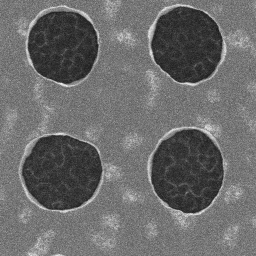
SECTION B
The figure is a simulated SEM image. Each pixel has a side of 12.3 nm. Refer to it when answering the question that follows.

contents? holes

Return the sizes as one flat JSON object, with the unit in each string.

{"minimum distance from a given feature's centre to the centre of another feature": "1.54 um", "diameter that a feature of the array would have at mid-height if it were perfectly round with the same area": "948 nanometers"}